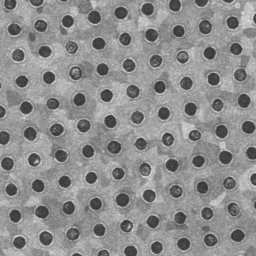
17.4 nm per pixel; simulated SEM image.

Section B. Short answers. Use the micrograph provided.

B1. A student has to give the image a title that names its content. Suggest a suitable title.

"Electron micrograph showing a regular array of holes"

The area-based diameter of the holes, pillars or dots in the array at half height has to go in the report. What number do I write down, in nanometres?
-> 234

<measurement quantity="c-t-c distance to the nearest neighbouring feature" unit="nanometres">456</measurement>